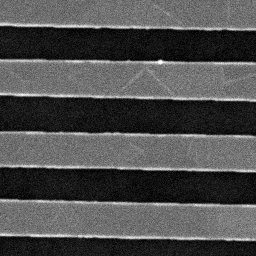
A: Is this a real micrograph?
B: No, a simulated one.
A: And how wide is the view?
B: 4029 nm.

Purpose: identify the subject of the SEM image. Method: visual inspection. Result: lines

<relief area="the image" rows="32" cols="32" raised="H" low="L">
HHHHHHHHHHHHHHHHHHHHHHHHHHHHHHHH
HHHHHHHHHHHHHHHHHHHHHHHHHHHHHHHH
HHHHHHHHHHHHHHHHHHHHHHHHHHHHHHHH
LLLLLLLLLLLLLLLLLLHLLHHHHHHHHHHH
LLLLLLLLLLLLLLLLLLLLLLLLLLLLLLLL
LLLLLLLLLLLLLLLLLLLLLLLLLLLLLLLL
LLLLLLLLLLLLLLLLLLLLLLLLLLLLLLLL
LLLLLLLLLLLLLLLLLLLLLLLLLLLLLLLL
HHHHHHHHHHHHHHHHHHHHHHHHHHHHHHHH
HHHHHHHHHHHHHHHHHHHHHHHHHHHHHHHH
HHHHHHHHHHHHHHHHHHHHHHHHHHHHHHHH
HHHHHHHHHHHHHHHHHHHHHHHHHHHHHHHH
LLLLLLLLLLLLLLLLLLLLLLLLLLLHHHHH
LLLLLLLLLLLLLLLLLLLLLLLLLLLLLLLL
LLLLLLLLLLLLLLLLLLLLLLLLLLLLLLLL
LLLLLLLLLLLLLLLLLLLLLLLLLLLLLLLL
LLLLLLLLLLLLLLLLLLLLLLLLLLLLLLLL
HHHHHHHHHHHHHHHHHHHHHHHHHHHHHHHH
HHHHHHHHHHHHHHHHHHHHHHHHHHHHHHHH
HHHHHHHHHHHHHHHHHHHHHHHHHHHHHHHH
HHHHHHHHHHHHHHHHHHHHHHHHHHHHHHHH
LLLLLLLLLLLLLLLLLLLLLLLLLLLLLLLL
LLLLLLLLLLLLLLLLLLLLLLLLLLLLLLLL
LLLLLLLLLLLLLLLLLLLLLLLLLLLLLLLL
LLLLLLLLLLLLLLLLLLLLLLLLLLLLLLLL
HHHHHHHHHHHHHHHHHHHHHLLLLLLLLLLL
HHHHHHHHHHHHHHHHHHHHHHHHHHHHHHHH
HHHHHHHHHHHHHHHHHHHHHHHHHHHHHHHH
HHHHHHHHHHHHHHHHHHHHHHHHHHHHHHHH
LLLHHHHHHHHHHHHHHHHHHHHHHHHHHHHH
LLLLLLLLLLLLLLLLLLLLLLLLLLLLLLLL
LLLLLLLLLLLLLLLLLLLLLLLLLLLLLLLL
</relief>